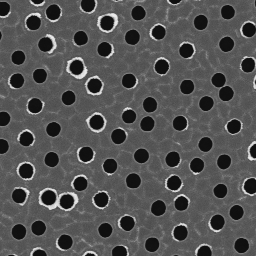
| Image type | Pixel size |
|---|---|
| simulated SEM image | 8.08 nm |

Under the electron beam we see a regular array of holes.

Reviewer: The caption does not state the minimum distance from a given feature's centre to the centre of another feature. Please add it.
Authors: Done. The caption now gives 206 nm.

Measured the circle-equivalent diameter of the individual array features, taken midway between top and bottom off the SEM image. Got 117 nm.